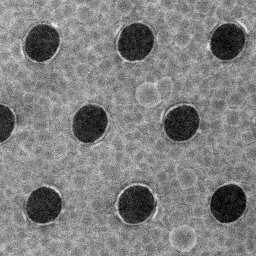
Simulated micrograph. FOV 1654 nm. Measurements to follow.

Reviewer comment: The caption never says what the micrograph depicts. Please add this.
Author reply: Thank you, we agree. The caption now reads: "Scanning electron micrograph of a regular array of raised bodies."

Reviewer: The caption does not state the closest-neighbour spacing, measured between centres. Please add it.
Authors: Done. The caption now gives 352 nanometres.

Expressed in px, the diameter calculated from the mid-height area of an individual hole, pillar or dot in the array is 38.4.